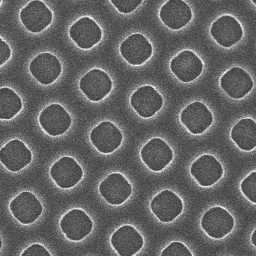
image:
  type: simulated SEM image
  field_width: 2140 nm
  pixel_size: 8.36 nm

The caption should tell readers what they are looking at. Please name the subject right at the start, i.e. a regular array of holes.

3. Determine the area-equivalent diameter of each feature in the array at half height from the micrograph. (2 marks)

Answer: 0.259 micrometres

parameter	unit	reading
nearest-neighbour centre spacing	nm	440